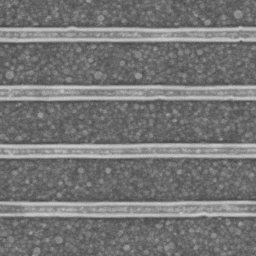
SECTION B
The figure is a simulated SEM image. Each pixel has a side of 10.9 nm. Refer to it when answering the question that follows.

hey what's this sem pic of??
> parallel lines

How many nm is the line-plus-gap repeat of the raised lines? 630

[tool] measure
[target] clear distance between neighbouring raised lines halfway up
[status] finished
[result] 0.518 microns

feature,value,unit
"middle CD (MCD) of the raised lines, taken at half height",118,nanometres